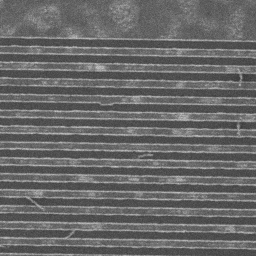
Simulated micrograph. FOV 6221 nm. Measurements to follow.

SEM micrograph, parallel lines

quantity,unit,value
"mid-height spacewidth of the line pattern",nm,207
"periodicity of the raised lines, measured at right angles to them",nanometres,388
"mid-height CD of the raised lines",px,7.5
